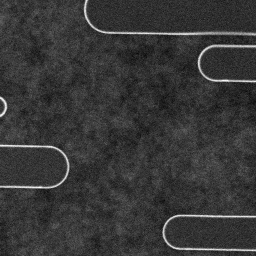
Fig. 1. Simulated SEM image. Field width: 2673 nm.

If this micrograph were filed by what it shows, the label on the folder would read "groups of lines, slits or small figures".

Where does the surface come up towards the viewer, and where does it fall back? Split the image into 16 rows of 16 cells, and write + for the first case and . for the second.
.....+++++++++++
......++++++++++
................
.............+++
.............+++
................
................
................
................
++++............
++++............
++++............
................
...........++...
..........++++++
...........+++++